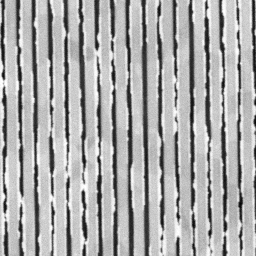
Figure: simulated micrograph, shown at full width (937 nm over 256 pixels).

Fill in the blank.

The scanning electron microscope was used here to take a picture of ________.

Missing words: parallel lines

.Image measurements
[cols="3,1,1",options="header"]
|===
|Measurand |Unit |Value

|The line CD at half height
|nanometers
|42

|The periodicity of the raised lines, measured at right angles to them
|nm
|57.3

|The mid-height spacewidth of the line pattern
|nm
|14.2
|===